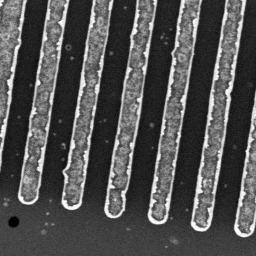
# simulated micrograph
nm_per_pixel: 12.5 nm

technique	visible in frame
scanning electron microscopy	parallel lines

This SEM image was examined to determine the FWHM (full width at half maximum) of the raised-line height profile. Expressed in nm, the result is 234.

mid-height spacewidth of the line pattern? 0.316 µm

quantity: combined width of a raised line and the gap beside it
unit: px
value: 43.7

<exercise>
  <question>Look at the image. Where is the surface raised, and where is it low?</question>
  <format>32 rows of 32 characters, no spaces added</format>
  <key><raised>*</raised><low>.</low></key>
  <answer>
***...**....**...**....**...***.
***...**....**...**...***...**..
***...**...***...**...***...**..
***...**...***...**...***...**..
**...***...**...***...**....**..
**...***...**...***...**...***..
**...***...**...***...**...***..
**...**....**...**....**...**...
**...**...***...**...***...**...
**...**...***...**...***...**...
**...**...**....**...**....**...
*...***...**...***...**...***...
*...***...**...***...**...***...
*...**....**...***...**...***...
*...**...***...**....**...**....
*...**...***...**...***...**...*
*...**...**....**...***...**...*
...***...**....**...**....**...*
...***...**...***...**...***...*
...**....**...***...**...***...*
...**...***...**....**...***...*
...**...***...**...***...**...**
...**...***...**...***...**...**
..***...**....**...**....**...**
..***...**...***...**....**...**
........**...***...**...***...**
.............**....**...***...**
...................**...**....**
........................**...***
..............................*.
................................
................................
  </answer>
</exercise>